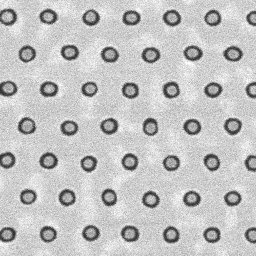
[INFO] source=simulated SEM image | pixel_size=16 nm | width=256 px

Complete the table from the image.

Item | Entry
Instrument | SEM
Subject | a regular array of ring-shaped grooves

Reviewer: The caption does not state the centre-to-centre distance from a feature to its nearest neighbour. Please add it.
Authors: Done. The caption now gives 0.64 micrometres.